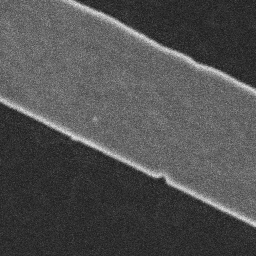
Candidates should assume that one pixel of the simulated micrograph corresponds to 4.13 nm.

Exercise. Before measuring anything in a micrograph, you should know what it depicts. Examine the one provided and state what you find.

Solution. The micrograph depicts one or a few lines or trenches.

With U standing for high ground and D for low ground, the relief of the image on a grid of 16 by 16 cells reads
UUUUUDDDDDDDDDDD
UUUUUUUUDDDDDDDD
UUUUUUUUUDDDDDDD
UUUUUUUUUUUUDDDD
UUUUUUUUUUUUUUDD
UUUUUUUUUUUUUUUU
UUUUUUUUUUUUUUUU
DDUUUUUUUUUUUUUU
DDDDUUUUUUUUUUUU
DDDDDDDUUUUUUUUU
DDDDDDDDDUUUUUUU
DDDDDDDDDDDUUUUU
DDDDDDDDDDDDDUUU
DDDDDDDDDDDDDDDU
DDDDDDDDDDDDDDDD
DDDDDDDDDDDDDDDD